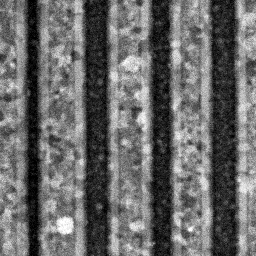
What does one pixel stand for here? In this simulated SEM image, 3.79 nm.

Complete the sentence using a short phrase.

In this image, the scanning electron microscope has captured one or a few lines or trenches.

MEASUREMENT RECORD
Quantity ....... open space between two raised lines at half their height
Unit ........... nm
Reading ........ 125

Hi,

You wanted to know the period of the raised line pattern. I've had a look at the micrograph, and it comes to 245 nm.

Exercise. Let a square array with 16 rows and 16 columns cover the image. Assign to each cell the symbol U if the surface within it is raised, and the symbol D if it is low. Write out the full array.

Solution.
UDDUUDDUUDDUUDDU
UDDUUDDUUDDUUDDU
UDDUUDDUUDDUUDDU
UDDUUDDUUDDUUDDU
UDDUUDDUUDDUUDDU
UDDUUDDUUDDUUDDU
UDDUUDDUUDDUUDDU
UDDUUDDUUDDUUDDU
UDDUUDDUUDDUUDDU
UDDUUDDUUDDUUDDU
UDDUUDDUUDDUUDDU
UDDUUDDUUDDUUDDU
UDDUUDDUUDDUUDDU
UDDUUDDUUDDUUDDU
UDDUUDDUUDDUUDDU
UDDUUDDUUDDUUDDU